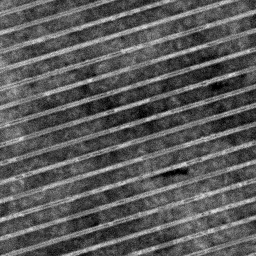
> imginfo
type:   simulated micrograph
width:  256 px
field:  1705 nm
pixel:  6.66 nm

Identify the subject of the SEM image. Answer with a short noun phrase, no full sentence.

parallel lines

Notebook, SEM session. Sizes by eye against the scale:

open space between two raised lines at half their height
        93.2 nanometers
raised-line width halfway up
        3.47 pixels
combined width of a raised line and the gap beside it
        119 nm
